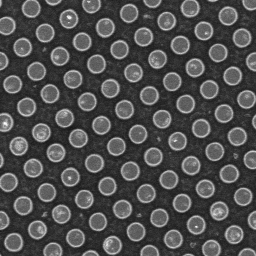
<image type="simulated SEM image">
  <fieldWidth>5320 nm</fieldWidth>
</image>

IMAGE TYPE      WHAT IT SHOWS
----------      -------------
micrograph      a regular array of raised bodies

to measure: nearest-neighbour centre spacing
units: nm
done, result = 546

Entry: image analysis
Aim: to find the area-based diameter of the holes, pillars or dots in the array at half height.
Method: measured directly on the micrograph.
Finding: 373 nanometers